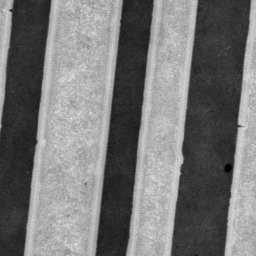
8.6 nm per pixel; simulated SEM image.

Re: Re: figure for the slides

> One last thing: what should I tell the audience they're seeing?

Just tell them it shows one or a few lines or trenches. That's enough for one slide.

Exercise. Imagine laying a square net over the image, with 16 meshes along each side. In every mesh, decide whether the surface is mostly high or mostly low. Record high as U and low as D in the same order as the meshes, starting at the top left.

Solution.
UDDUUUUDDDUUDDDD
UDDUUUUDDDUUDDDD
DDDUUUUDDDUUDDDD
DDDUUUUDDUUUDDDU
DDDUUUUDDUUUDDDU
DDDUUUUDDUUUDDDU
DDDUUUUDDUUUDDDU
DDDUUUUDDUUDDDDU
DDDUUUUDDUUDDDDU
DDUUUUDDDUUDDDDU
DDUUUUDDDUUDDDDU
DDUUUUDDDUUDDDDU
DDUUUUDDUUUDDDDU
DDUUUUDDUUUDDDUU
DDUUUUDDUUUDDDUU
DDUUUUDDUUUDDDUU